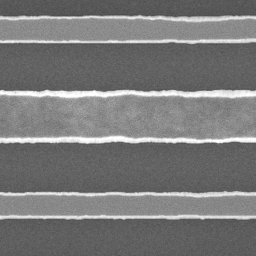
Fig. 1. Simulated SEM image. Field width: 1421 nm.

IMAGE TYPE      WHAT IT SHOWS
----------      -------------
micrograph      lines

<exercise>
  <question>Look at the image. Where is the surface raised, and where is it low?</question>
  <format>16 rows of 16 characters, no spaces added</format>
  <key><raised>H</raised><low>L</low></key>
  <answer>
LLLLLLLLLLLLLLLL
HHHHHHHHHHHHHHHH
HHHHHHHHHHHHHHHH
LLLLLLLLLLLLLLLL
LLLLLLLLLLLLLLLL
LLLLLLLLLLLLLLLL
HHHHHHHHHHHHHHHH
HHHHHHHHHHHHHHHH
HHHHHHHHHHHHHHHH
LLLLLLLLLLLLLLLL
LLLLLLLLLLLLLLLL
LLLLLLLLLLLLLLLL
HHHHHHHHHHHHHHHH
HHHHHHHHHHHHHHHH
LLLLLLLLLLLLLLLL
LLLLLLLLLLLLLLLL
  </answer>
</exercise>